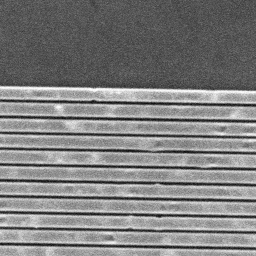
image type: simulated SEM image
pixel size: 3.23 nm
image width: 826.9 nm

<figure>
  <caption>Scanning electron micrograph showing parallel lines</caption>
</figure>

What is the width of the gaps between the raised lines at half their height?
12.1 nanometers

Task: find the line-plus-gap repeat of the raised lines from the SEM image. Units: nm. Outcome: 51.3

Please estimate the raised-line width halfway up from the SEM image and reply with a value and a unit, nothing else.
39.9 nm